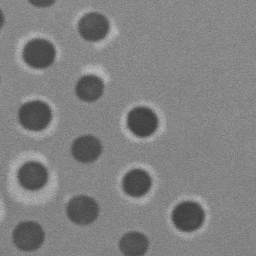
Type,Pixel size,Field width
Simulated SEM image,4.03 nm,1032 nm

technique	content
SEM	a regular array of holes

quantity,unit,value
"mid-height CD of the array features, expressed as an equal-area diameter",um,0.13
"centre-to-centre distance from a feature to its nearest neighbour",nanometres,244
